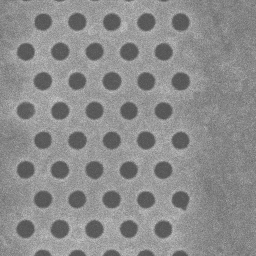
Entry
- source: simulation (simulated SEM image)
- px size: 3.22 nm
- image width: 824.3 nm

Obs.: a regular array of holes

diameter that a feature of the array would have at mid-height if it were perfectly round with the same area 58.5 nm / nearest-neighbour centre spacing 110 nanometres